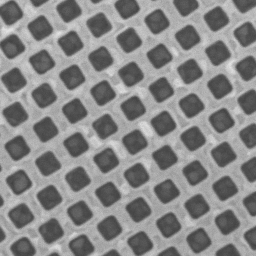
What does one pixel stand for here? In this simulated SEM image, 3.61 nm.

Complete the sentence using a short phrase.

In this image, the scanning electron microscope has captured a regular array of holes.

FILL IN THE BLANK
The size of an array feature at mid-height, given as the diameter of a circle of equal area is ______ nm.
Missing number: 86.2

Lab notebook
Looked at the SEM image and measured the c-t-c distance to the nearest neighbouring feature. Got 121 nanometres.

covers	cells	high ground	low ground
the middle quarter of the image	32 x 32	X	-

X--XXXX-----XXX----XXX---XXXX---
----XXXX--XXXX-----XXXXXXXXX----
-----XXXXXXXX-------XXXXXXXXX---
-----XXXXXXXXX------XXXX-XXXX---
-----XXXX--XXXX----XXX----XXXX--
----XXX-----XXX--XXXX------XXXXX
XXXXXXX-----XXXXXXXXX------XXXXX
XXXXXXX------XXXXXXXXX-----XXXX-
XXXXXXX------XXX---XXX----XXX---
X---XXXX---XXXX----XXXX-XXXXX---
-----XXXX-XXXX------XXXXXXXXX---
------XXXXXXXX------XXXXXXXXX---
------XXXX-XXXX-----XXXX--XXXX--
-----XXXX---XXXX--XXXX-----XXXX-
X---XXX------XXXXXXXXX------XXXX
XXXXXXX------XXXXXXXXX------XXXX
XXXXXXXX------XXX--XXXX----XXX--
XX---XXX-----XXX----XXX---XXX---
X----XXXX--XXXX-----XXXXXXXXX---
------XXXXXXXXX------XXXXXXXX---
------XXXXXXXXX------XXXX--XXX--
X-----XXX---XXXX----XXX----XXXX-
X---XXXX-----XXX--XXXX------XXXX
XXXXXXX-------XXXXXXXX------XXXX
XXXXXXXX------XXXXXXXXX-----XXXX
XXXXXXXX-----XXXX---XXXX---XXXX-
XX---XXXX---XXX-----XXXXX-XXXX--
X-----XXXXXXXXX------XXXXXXXXX--
------XXXXXXXXX------XXXXXXXXX--
X------XXXX-XXXX-----XXX---XXXX-
X-----XXX----XXXX--XXXX-----XXXX
XX--XXXX------XXXXXXXX-------XXX